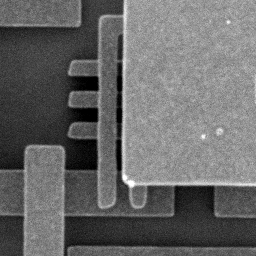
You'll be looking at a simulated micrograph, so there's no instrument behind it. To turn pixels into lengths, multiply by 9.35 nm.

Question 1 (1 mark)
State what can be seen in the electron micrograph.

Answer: wiring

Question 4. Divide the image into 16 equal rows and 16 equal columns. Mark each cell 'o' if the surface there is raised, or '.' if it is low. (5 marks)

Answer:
........oooooooo
........oooooooo
........oooooooo
........oooooooo
........oooooooo
........oooooooo
........oooooooo
........oooooooo
........oooooooo
........oooooooo
........oooooooo
........oooooooo
................
................
................
................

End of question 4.